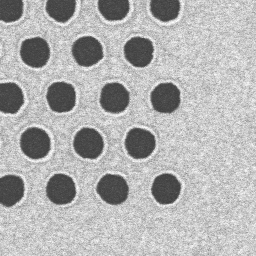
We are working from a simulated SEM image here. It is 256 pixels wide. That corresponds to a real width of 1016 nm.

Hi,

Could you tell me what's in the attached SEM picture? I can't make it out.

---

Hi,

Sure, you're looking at a regular array of holes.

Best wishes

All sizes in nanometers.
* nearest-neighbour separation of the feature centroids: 205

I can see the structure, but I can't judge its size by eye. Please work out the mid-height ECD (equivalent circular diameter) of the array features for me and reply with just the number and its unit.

0.12 microns